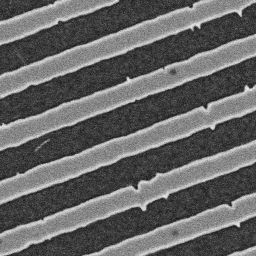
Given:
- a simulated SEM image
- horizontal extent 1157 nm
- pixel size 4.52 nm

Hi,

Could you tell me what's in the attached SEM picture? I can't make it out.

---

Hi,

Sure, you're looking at parallel lines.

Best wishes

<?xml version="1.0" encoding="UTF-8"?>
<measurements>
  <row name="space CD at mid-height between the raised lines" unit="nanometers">129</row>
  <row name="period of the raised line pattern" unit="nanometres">224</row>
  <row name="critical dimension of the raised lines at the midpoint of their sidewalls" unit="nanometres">96.3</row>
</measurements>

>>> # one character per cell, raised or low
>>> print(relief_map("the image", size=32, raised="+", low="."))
......++++++++..........+++++++.
....+++++++..........+++++++++..
.+++++++...........+++++++......
++++++..........++++++++........
+++..........++++++++..........+
...........++++++++.........++++
........++++++++..........++++++
.....++++++++..........++++++++.
...+++++++...........+++++++....
+++++++...........++++++++......
+++++..........++++++++.........
++..........++++++++..........++
..........+++++++...........++++
.......+++++++...........+++++++
....++++++++..........++++++++..
.++++++++..........++++++++.....
++++++...........+++++++........
++++..........++++++++..........
+..........++++++++..........+++
.........+++++++...........+++++
.....+++++++++..........+++++++.
...++++++++..........++++++++...
.+++++++...........+++++++......
+++++...........+++++++.........
+++..........++++++++..........+
..........+++++++++..........+++
.......++++++++..........+++++++
.....+++++++...........++++++++.
..++++++++..........++++++++....
+++++++..........++++++++.......
++++...........+++++++..........
++..........+++++++...........++